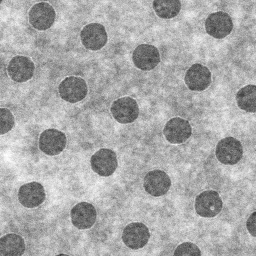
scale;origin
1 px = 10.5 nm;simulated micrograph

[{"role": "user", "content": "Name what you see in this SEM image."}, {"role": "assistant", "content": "a regular array of raised bodies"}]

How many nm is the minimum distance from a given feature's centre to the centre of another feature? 589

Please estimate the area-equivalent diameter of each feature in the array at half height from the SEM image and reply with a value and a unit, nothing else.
0.308 microns